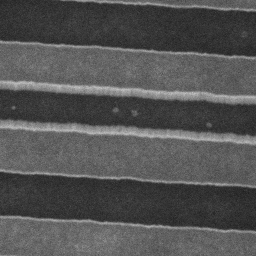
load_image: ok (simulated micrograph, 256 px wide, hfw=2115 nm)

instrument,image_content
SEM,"lines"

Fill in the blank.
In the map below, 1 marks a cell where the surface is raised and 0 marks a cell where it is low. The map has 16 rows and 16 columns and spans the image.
0000000000000111
0000000000000000
0000000000000000
1111111111111100
1111111111111111
0000011111111111
0000000000000000
0000000000000000
1111111111110000
1111111111111111
1111111111111111
0000000000000111
0000000000000000
0000000000000000
1111111111111111
1111111111111111